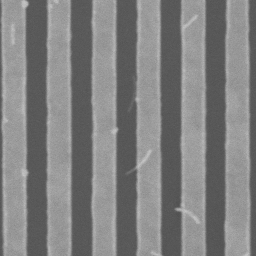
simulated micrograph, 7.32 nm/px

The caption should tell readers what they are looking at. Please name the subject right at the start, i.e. lines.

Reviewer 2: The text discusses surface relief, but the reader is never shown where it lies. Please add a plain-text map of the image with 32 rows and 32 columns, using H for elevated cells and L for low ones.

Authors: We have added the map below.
HHHLLLHHHLLLHHLLLHHHLLLHHHLLHHHL
HHHLLLHHHLLLHHLLLHHHLLLHHHLLHHHL
HHHLLLHHHLLLHHLLLHHHLLLHHHLLHHHL
HHHLLLHHHLLLHHLLLHHHLLLHHHLLHHHL
HHHLLLHHHLLLHHLLLHHHLLLHHHLLHHHL
HHHLLLHHHLLLHHLLLHHHLLLHHHLLHHHL
HHHLLLHHHLLLHHLLLHHHLLLHHHLLHHHL
HHHLLLHHHLLLHHLLLHHHLLLHHHLLHHHL
HHHLLLHHHLLLHHLLLHHHLLLHHHLLHHHL
HHHLLLHHHLLLHHLLLHHHLLLHHHLLHHHL
HHHLLLHHHLLLHHLLLHHHLLLHHHLLHHHL
HHHLLLHHHLLLHHLLLHHHLLLHHHLLHHHL
HHHLLLHHHLLLHHLLLHHHLLLHHHLLHHHL
HHHLLLHHHLLLHHLLLHHHLLLHHHLLHHHL
HHHLLLHHHLLLHHLLLHHHLLLHHHLLHHHL
HHHLLLHHHLLLHHLLLHHHLLLHHHLLHHHL
HHHLLLHHHLLLHHHLLHHHLLLHHHLLHHHL
HHHLLLHHHLLLHHLLLHHHLLLHHHLLHHHL
HHHLLLHHHLLLHHLLLHHHLLLHHHLLHHHL
HHHLLLHHHLLLHHLLLHHHLLLHHHLLHHHL
HHHLLLHHHLLLHHLLLHHHLLLHHHLLHHHL
HHHLLLHHHLLLHHLLLHHHLLLHHHLLHHHL
HHHLLLHHHLLLHHLLLHHHLLLHHHLLHHHL
HHHLLLHHHLLLHHLLLHHHLLLHHHLLHHHL
HHHLLLHHHLLLHHLLLHHHLLLHHHLLHHHL
HHHLLLHHHLLLHHLLLHHHLLLHHHLLHHHL
HHHLLLHHHLLLHHLLLHHHLLHHHHLLHHHL
HHHLLLHHHLLLHHLLLHHHLLLHHHLLHHHL
HHHLLLHHHLLLHHLLLHHHLLLHHHLLHHHL
HHHLLLHHHLLLHHLLLHHHLLLHHHLLHHHL
HHHLLLHHHLLLHHLLLHHHLLLHHHLLHHHL
HHHLLLHHHLLLHHLLLHHHLLLHHHLLHHHL